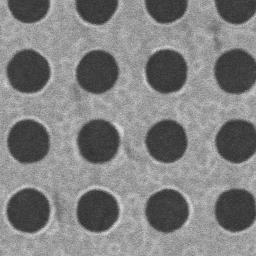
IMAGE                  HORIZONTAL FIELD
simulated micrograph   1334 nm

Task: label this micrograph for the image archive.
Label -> a regular array of holes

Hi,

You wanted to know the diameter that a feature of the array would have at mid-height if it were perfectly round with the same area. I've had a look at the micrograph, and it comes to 228 nm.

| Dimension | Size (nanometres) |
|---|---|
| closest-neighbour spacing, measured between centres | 358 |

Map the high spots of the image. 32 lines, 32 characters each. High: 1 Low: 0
10000011100000011100000111100000
10000011110000111100000111100000
11000111110000111110001111110001
11111111111111111111111111111111
11111111111111111111111111111111
11111111111111111111111111111111
11000111111001111110001111110001
10000011110000111110000111100000
10000011110000011100000111100000
10000011110000011100000111100000
10000011110000111110000111100000
11100111111001111111001111110001
11111111111111111111111111111111
11111111111111111111111111111111
11111111111111111111111111111111
11000111111000111110001111110000
10000011110000011100000111100000
10000011110000011100000111100000
10000011110000011100000111100000
11000011110000111110000111110000
11111111111111111111111111111111
11111111111111111111111111111111
11111111111111111111111111111111
11111111111111111111111111111111
11000011110000111110000111100000
10000011110000011100000111100000
10000011100000011100000011100000
10000011110000011100000111100000
11000111110000111110001111110001
11111111111111111111111111111111
11111111111111111111111111111111
11111111111111111111111111111111